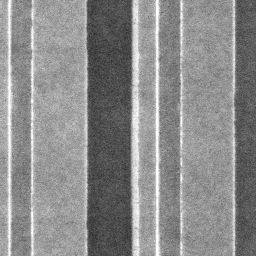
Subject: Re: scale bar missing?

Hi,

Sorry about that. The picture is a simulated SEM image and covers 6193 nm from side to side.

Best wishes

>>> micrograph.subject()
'lines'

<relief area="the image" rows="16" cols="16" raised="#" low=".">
#####....######.
#####....######.
#####....######.
#####....######.
#####....######.
#####....######.
#####....######.
#####....######.
#####....######.
#####....######.
#####....######.
#####....######.
#####....######.
#####....######.
#####....######.
#####....######.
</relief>